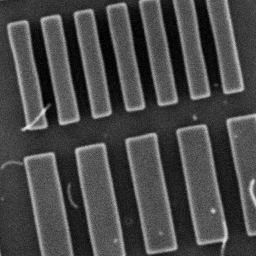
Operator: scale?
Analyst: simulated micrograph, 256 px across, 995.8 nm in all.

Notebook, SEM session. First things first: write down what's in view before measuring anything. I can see groups of lines, slits or small figures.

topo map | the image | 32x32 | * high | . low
..................**..**..**....
..........**.***..**..**..***...
.....***.***..**..**..***.***...
.***.***..**..**..***.***..**...
.***.***..**..**..***..**..**...
.***..**..**..***.***..**..**...
..**..**..***.***..**..**..***..
..**..***.***..**..**..**..***..
..**..***.***..**..**..***.***..
..***.***..**..**..***.***..**..
..***..**..**..***.***..**..**..
...**..**..**..***..**..**..**..
...**..**..***..**..**..........
...***.***.***..**..............
...***.***..*..................*
...***......................****
......................****...***
................****..****...***
..........***...****..****...***
....***...***...****...****..***
...****...****..****...****..***
...****...****..****...****...**
....***...****...****..****...**
....****..****...****..****...**
....****..****...****...***...**
....****...****..****...****..**
....****...****..****...****..**
....****...****...***...****...*
.....****..****...****..****...*
.....****..****...****...***....
.....****..****...****...*......
.....****...****...**...........